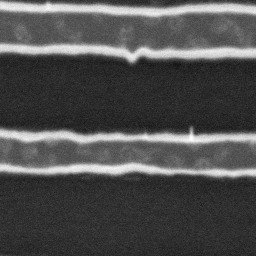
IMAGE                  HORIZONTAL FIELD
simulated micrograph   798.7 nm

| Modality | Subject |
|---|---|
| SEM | one or a few lines or trenches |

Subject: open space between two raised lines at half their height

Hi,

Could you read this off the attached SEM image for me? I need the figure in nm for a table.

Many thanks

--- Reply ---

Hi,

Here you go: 262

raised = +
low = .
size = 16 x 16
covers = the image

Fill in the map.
++++........+++.
++++++++++++++++
++++++++++++++++
................
................
................
................
................
+..++...........
++++++++++++++++
++++++++++++++++
................
................
................
................
................